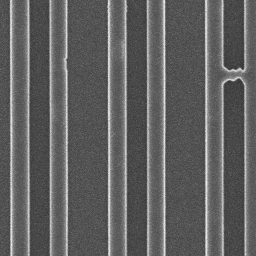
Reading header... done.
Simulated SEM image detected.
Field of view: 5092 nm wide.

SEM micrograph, parallel lines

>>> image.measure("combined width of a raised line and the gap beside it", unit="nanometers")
965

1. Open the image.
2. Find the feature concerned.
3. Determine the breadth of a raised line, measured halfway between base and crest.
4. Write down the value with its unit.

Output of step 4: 0.338 µm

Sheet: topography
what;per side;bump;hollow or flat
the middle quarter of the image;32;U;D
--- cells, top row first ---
DDDDDDDDDDDUUUUDDDDDDUUUUDDDDDDD
UDDDDDDDDDDUUUUDDDDDDUUUUDDDDDDD
UDDDDDDDDDDUUUUDDDDDDUUUUDDDDDDD
UDDDDDDDDDDUUUUDDDDDDUUUUDDDDDDD
UDDDDDDDDDDUUUUDDDDDDUUUUDDDDDDD
UDDDDDDDDDDUUUUDDDDDDUUUUDDDDDDD
UDDDDDDDDDDUUUUDDDDDDUUUUDDDDDDD
UDDDDDDDDDDUUUUDDDDDDUUUUDDDDDDD
UDDDDDDDDDDUUUUDDDDDDUUUUDDDDDDD
UDDDDDDDDDDUUUUDDDDDDUUUUDDDDDDD
UDDDDDDDDDDUUUUDDDDDDUUUUDDDDDDD
UDDDDDDDDDDUUUUDDDDDDUUUUDDDDDDD
UDDDDDDDDDDUUUUDDDDDDUUUUDDDDDDD
UDDDDDDDDDDUUUUDDDDDDUUUUDDDDDDD
UDDDDDDDDDDUUUUDDDDDDUUUUDDDDDDD
UDDDDDDDDDDUUUUDDDDDDUUUUDDDDDDD
UDDDDDDDDDDUUUUDDDDDDUUUUDDDDDDD
UDDDDDDDDDDUUUUDDDDDDUUUUDDDDDDD
UDDDDDDDDDDUUUUDDDDDDUUUUDDDDDDD
UDDDDDDDDDDUUUUDDDDDDUUUUDDDDDDD
UDDDDDDDDDDUUUUDDDDDDUUUUDDDDDDD
UDDDDDDDDDDUUUUUDDDDDUUUUDDDDDDD
UDDDDDDDDDDUUUUUDDDDDUUUUDDDDDDD
UDDDDDDDDDDUUUUDDDDDDUUUUDDDDDDD
UDDDDDDDDDDUUUUDDDDDDUUUUDDDDDDD
UDDDDDDDDDDUUUUDDDDDDUUUUDDDDDDD
UDDDDDDDDDDUUUUDDDDDDUUUUDDDDDDD
UDDDDDDDDDDUUUUDDDDDDUUUUDDDDDDD
UDDDDDDDDDDUUUUDDDDDDUUUUDDDDDDD
UDDDDDDDDDDUUUUDDDDDDUUUUDDDDDDD
UDDDDDDDDDDUUUUDDDDDDUUUUDDDDDDD
UDDDDDDDDDDUUUUDDDDDDUUUUDDDDDDD